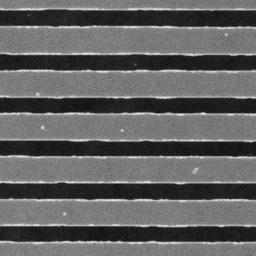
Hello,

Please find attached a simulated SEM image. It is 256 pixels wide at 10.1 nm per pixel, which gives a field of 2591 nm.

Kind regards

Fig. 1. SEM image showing lines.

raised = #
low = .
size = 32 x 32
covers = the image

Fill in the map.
################################
................................
................................
################################
################################
################################
################################
................................
................................
################################
################################
################################
................................
................................
################################
################################
################################
........###.####################
................................
................................
################################
################################
################################
................................
................................
################################
################################
################################
................................
................................
################################
################################